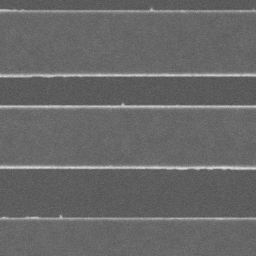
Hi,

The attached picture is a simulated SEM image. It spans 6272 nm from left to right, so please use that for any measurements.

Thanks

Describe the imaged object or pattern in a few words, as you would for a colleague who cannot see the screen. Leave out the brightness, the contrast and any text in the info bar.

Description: lines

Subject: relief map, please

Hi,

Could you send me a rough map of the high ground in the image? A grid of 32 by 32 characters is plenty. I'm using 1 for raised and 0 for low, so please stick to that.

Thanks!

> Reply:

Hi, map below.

00000000000000000000000000000000
11111111111111111111111111111111
11111111111111111111111111111111
11111111111111111111111111111111
11111111111111111111111111111111
11111111111111111111111111111111
11111111111111111111111111111111
11111111111111111111111111111111
11111111111111111111111111111111
00000000000000000000000000000000
00000000000000000000000000000000
00000000000000000000000000000000
00000000000000000000000000000000
11111111111111111111111111111111
11111111111111111111111111111111
11111111111111111111111111111111
11111111111111111111111111111111
11111111111111111111111111111111
11111111111111111111111111111111
11111111111111111111111111111111
11111111111111111111111111111111
00000000000000000000000000000000
00000000000000000000000000000000
00000000000000000000000000000000
00000000000000000000000000000000
00000000000000000000000000000000
00000000000000000000000000000000
11111111111111111111111111111111
11111111111111111111111111111111
11111111111111111111111111111111
11111111111111111111111111111111
11111111111111111111111111111111